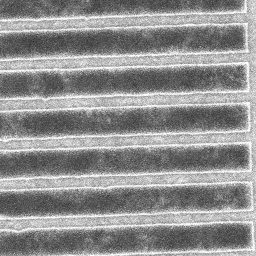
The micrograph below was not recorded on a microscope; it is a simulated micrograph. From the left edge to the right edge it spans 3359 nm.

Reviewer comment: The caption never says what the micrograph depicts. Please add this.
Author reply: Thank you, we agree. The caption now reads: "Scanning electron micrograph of parallel lines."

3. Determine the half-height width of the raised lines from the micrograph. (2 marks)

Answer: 28.8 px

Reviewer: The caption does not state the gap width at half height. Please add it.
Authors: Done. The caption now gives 10.7 px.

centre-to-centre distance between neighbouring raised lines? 521 nanometers